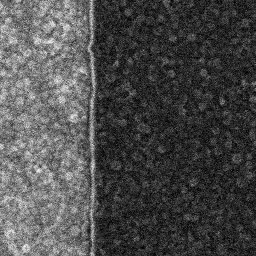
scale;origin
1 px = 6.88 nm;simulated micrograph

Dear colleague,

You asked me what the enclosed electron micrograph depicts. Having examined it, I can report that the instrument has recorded one or a few lines or trenches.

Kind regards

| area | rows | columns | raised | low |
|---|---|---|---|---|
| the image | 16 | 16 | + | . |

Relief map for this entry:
......++++++++++
......++++++++++
......++++++++++
......++++++++++
......++++++++++
......++++++++++
......++++++++++
......++++++++++
......++++++++++
......++++++++++
......++++++++++
......++++++++++
......++++++++++
......++++++++++
......++++++++++
......++++++++++